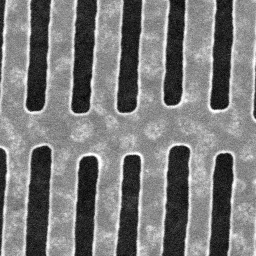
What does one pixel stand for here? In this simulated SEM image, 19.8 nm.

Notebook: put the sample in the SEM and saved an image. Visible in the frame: holes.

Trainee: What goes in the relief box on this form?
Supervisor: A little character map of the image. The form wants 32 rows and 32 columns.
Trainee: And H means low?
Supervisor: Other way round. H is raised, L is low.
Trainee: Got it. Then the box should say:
LHHHLLHHHHLLHHHLLLHHHLLHHHHLLHHH
LHHHLLHHHLLLHHHLLLHHHLLHHHHLLHHH
LHHHLLHHHLLLHHHLLLHHHLLHHHHLLHHH
HHHHLLHHHLLLHHHLLLHHHLLHHHHLLHHH
HHHHLLHHHLLLHHHLLLHHHLLHHHHLLHHH
HHHHLLHHHLLLHHHLLHHHHLLHHHHLLHHH
HHHHLLHHHLLLHHHLLHHHHLLHHHHLLHHH
HHHHLLHHHLLLHHHLLHHHHLLHHHHLLHHH
HHHHLLHHHLLLHHHLLHHHHLLHHHHLLHHH
HHHLLLHHHLLLHHHLLHHHHLLHHHLLLHHH
HHHLLLHHHLLHHHHLLHHHLLLHHHLLLHHH
HHHLLLHHHLLHHHHLLHHHLLLHHHLLLHHH
HHHLLLHHHLLHHHHLLHHHLLLHHHLLLHHH
HHHLLHHHHLLHHHHLLHHHHHHHHHLLHHHH
HHHHHHHHHHHHHHHHHHHHHHHHHHHHHHHH
HHHHHHHHHHHHHHHHHHHHHHHHHHHHHHHH
HHHHHHHHHHHHHHHHHHHHHHHHHHHHHHHH
HHHHHHHHHHHHHHHHHHHHHHHHHHHHHHHH
HHHHLLHHHHHHHHHHHHHHHLLHHHHHHHHH
LHHHLLHHHHLLHHHHLHHHHLLLHHHLLHHH
LHHHLLHHHHLLHHHLLLHHHLLLHHHLLHHH
LHHHLLHHHHLLHHHLLLHHHLLLHHHLLHHH
LHHHLLHHHHLLHHHLLLHHHLLLHHHLLHHH
LHHHLLHHHHLLHHHLLLHHHLLLHHHLLHHH
LHHLLLHHHHLLHHHLLHHHHLLLHHLLLHHH
LHHLLLHHHHLLHHHLLHHHHLLLHHLLLHHH
LHHLLLHHHLLLHHHLLHHHHLLLHHLLLHHH
HHHLLLHHHLLLHHHLLHHHHLLLHHLLLHHH
HHHLLLHHHLLLHHHLLHHHLLLHHHLLLHHH
HHHLLLHHHLLLHHHLLHHHLLLHHHLLLHHH
HHHLLLHHHLLLHHHLLHHHLLLHHHLLLHHH
HHHLLLHHHLLLHHHLLHHHLLLHHHLLLHHH